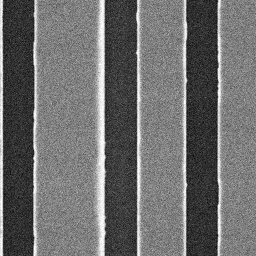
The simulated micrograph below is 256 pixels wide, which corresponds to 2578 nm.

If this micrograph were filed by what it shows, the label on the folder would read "lines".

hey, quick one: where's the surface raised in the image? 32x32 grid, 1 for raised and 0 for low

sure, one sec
00001111111110000111111000011111
00001111111110000111111000011111
00001111111110000111111000011111
00001111111110000111111000011111
00001111111110000111111000011111
00001111111110000111111000011111
00001111111110000111111000011111
00001111111110000111111000011111
00001111111110000111111000011111
00001111111110000111111000011111
00001111111110000111111000011111
00001111111110000111111000011111
00001111111110000111111000011111
00001111111110000111111000011111
00001111111110000111111000011111
00001111111110000111111000011111
00001111111110000111111000011111
00001111111110000111111000011111
00001111111110000111111000011111
00001111111110000111111000011111
00001111111110000111111000011111
00001111111110000111111000011111
00001111111110000111111000011111
00001111111110000111111000011111
00001111111110000111111000011111
00001111111110000111111000011111
00001111111110000111111000011111
00001111111110000111111000011111
00001111111110000111111000011111
00001111111110000111111000011111
00001111111110000111111000011111
00001111111110000111111000011111